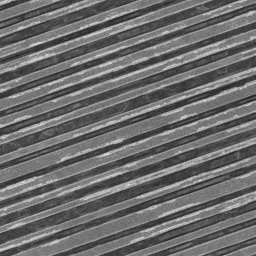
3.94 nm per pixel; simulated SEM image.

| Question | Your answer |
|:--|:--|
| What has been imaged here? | parallel lines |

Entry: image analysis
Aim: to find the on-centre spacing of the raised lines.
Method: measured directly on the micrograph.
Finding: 66.5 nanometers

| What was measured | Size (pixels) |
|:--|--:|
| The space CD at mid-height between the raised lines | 7.54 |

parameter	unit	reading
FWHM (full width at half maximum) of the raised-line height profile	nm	33.1